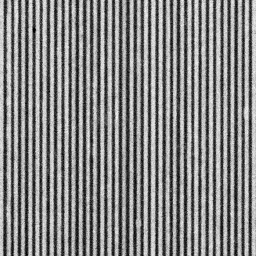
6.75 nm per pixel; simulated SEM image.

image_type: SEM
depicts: parallel lines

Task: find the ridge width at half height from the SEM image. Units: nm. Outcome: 20.2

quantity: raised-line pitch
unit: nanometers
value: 48.8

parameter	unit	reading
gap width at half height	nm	30.4